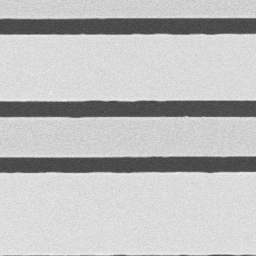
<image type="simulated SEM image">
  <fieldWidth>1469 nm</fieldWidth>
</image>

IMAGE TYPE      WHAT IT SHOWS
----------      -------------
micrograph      lines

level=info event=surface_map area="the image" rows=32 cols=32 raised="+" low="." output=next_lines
++++++++++++++++++++++++++++++++
++++++++++++++++++++++++++++++++
................................
................................
++++++++++++++++++++++++++++++++
++++++++++++++++++++++++++++++++
++++++++++++++++++++++++++++++++
++++++++++++++++++++++++++++++++
++++++++++++++++++++++++++++++++
++++++++++++++++++++++++++++++++
++++++++++++++++++++++++++++++++
++++++++++++++++++++++++++++++++
+++++++++++.++++++.++.........+.
................................
................................
++++++++++++++++++++++++++++++++
++++++++++++++++++++++++++++++++
++++++++++++++++++++++++++++++++
++++++++++++++++++++++++++++++++
+++++++++++++++++++.+......++...
................................
................................
++++++++++++++++++++++++++++++++
++++++++++++++++++++++++++++++++
++++++++++++++++++++++++++++++++
++++++++++++++++++++++++++++++++
++++++++++++++++++++++++++++++++
++++++++++++++++++++++++++++++++
++++++++++++++++++++++++++++++++
++++++++++++++++++++++++++++++++
++++++++++++++++++++++++++++++++
++++++++++++++++++++++++++++++++